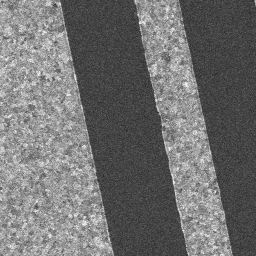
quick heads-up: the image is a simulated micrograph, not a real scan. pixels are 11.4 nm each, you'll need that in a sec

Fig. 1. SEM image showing one or a few lines or trenches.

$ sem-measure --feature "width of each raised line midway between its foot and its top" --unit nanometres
487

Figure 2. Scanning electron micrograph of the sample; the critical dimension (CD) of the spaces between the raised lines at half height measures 847 nm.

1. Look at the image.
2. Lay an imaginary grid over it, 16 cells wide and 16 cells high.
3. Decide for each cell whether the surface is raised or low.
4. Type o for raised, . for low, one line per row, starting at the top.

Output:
oooo.....oo.....
oooo.....oo.....
oooo.....ooo....
oooo.....ooo....
ooooo....ooo....
ooooo.....oo....
ooooo.....ooo...
ooooo.....ooo...
ooooo.....ooo...
oooooo....ooo...
oooooo.....oo...
oooooo.....ooo..
oooooo.....ooo..
ooooooo....ooo..
ooooooo....ooo..
ooooooo.....oo..